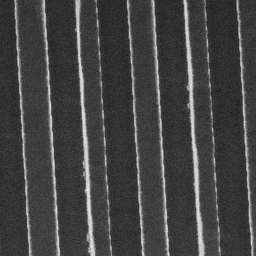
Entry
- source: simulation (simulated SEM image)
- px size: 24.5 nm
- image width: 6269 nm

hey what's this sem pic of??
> lines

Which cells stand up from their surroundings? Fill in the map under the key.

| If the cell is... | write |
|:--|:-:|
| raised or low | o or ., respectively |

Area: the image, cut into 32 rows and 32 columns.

..oooo....oo....ooo....ooo....oo
..oooo....oo....ooo....ooo....oo
..oooo....oo....ooo....ooo....oo
..oooo....oo....ooo....ooo....oo
..oooo....oo....ooo....ooo....oo
..oooo....oo....ooo.....oo....oo
..oooo....oo....oooo....oo....oo
..oooo....oo....oooo....oo....oo
..oooo....ooo....ooo....oo....oo
..oooo....ooo....ooo....oo....oo
..oooo....ooo....ooo....oo....oo
..oooo....ooo....ooo....oo....oo
...ooo....ooo....ooo....oo....oo
...ooo....ooo....ooo....oo....oo
...ooo....ooo....ooo....oo....oo
...ooo....ooo....ooo....oo.....o
...oooo....oo....ooo....ooo....o
...oooo....oo....ooo....ooo....o
...oooo....oo....ooo....ooo....o
...oooo....oo....ooo....ooo....o
...oooo....oo....ooo.....oo....o
...oooo....oo....ooo.....oo....o
...oooo....oo....oooo....oo....o
...oooo....oo....oooo....oo....o
...oooo....oo....oooo....oo....o
...oooo....ooo...oooo....oo....o
...oooo....ooo....ooo....oo....o
...oooo....ooo....ooo....oo....o
...oooo....ooo....ooo....oo....o
....ooo....ooo....ooo....oo....o
....ooo....ooo....ooo....oo....o
....ooo.....oo....ooo....oo.....